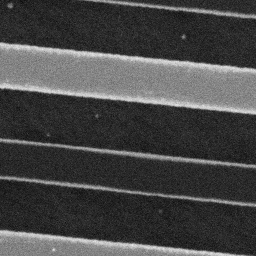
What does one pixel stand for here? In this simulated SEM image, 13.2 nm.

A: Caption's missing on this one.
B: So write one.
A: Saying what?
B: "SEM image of lines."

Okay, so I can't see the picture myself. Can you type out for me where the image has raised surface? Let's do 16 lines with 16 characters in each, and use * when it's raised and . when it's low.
..........******
................
................
********........
****************
****************
..........******
................
................
*******.........
****************
....************
............****
................
*...............
***********.....